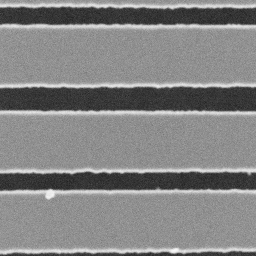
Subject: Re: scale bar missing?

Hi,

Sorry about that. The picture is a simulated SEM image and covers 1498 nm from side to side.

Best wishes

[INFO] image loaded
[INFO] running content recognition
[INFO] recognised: lines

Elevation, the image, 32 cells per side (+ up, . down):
++++++++++++++++++++++++++++++++
................................
................................
++++++++++++++++++++++++++++++++
++++++++++++++++++++++++++++++++
++++++++++++++++++++++++++++++++
++++++++++++++++++++++++++++++++
++++++++++++++++++++++++++++++++
++++++++++++++++++++++++++++++++
++++++++++++++++++++++++++++++++
++++++++++++++++++++++++++++++++
................................
................................
................................
++++++++++++++++++++++++++++++++
++++++++++++++++++++++++++++++++
++++++++++++++++++++++++++++++++
++++++++++++++++++++++++++++++++
++++++++++++++++++++++++++++++++
++++++++++++++++++++++++++++++++
++++++++++++++++++++++++++++++++
++++++++++..++...+..............
................................
................................
++++++++++++++++++++++++++++++++
++++++++++++++++++++++++++++++++
++++++++++++++++++++++++++++++++
++++++++++++++++++++++++++++++++
++++++++++++++++++++++++++++++++
++++++++++++++++++++++++++++++++
++++++++++++++++++++++++++++++++
++++++++++++++++++++.++++.......